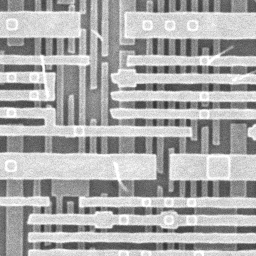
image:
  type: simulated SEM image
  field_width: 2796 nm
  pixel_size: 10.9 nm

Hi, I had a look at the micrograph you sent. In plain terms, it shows wiring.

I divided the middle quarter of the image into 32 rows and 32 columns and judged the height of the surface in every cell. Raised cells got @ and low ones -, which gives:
--------------------------------
--------------------------------
------------@@@@@@@------------@
------------@@@@@@@@@@@@@@@@@@@@
------------@@@@@@@@@@@@@@@@@@@@
--------------@@@@--------------
--------------------------------
------------@@@@@@@@@@@@@@@@@@@@
------------@@@@@@@@@@@@@@@@@@@@
--------------------------------
--------------------------------
------------@@@@@@@@@@@@@@@@@-@@
------------@@@@@@@@@@@@@@@@@@@@
-------------@@@----------@@---@
--------------------------------
--------------------------------
@@@@@@@@@@@@@@@@@@@@@@@@@@@@@@@@
@@@@@@@@@@@@@@@@@@@@@@@@@@@@@@@@
--------------------------------
--------------------------------
--------------------------------
--------------------------------
--@@@@--------------------------
@@@@@@@@@@@@@@@@@@@@@@@----@@@@@
@@@@@@@@@@@@@@@@@@@@@@@----@@@@@
@@@@@@@@@@@@@@@@@@@@@@@----@@@@@
@@@@@@@@@@@@@@@@@@@@@@@----@@@@@
@@@@@@@@@@@@@@@@@@@@@@@----@@@@@
@@@@@@@@@@@@@@@@@@@@@@@----@@@@@
--------------------------------
--------------------------------
--------------------------------